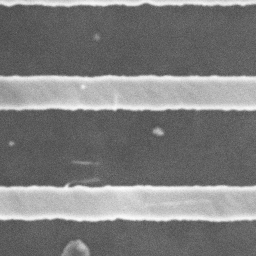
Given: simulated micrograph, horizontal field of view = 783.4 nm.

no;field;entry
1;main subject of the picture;lines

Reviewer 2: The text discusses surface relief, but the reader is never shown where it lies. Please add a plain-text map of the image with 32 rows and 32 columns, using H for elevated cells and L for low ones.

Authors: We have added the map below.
HHHHHHHHHHHHHHHHHHLHHHHHHHHHHHHH
LLLLLLLLLLLLLLLLLLLLLLLLLLLLLLLL
LLLLLLLLLLLLLLLLLLLLLLLLLLLLLLLL
LLLLLLLLLLLLLLLLLLLLLLLLLLLLLLLL
LLLLLLLLLLLLLLLLLLLLLLLLLLLLLLLL
LLLLLLLLLLLLLLLLLLLLLLLLLLLLLLLL
LLLLLLLLLLLLLLLLLLLLLLLLLLLLLLLL
LLLLLLLLLLLLLLLLLLLLLLLLLLLLLLLL
LLLLLLLLLLLLLLLLLLLLLLLLLLLLLLLL
LLLLLLLLLLLLLHLLLLLLLLLLLLLLLLLL
HHHHHHHHHHHHHHHHHHHHHHHHHHHHHHHH
HHHHHHHHHHHHHHHHHHHHHHHHHHHHHHHH
HHHHHHHHHHHHHHHHHHHHHHHHHHHHHHHH
HHHHHHLHHHHHHHHHHHHHHHHHHHHHHHHH
LLLLLLLLLLLLLLLLLLLLLLLLLLLLLLLL
LLLLLLLLLLLLLLLLLLLLLLLLLLLLLLLL
LLLLLLLLLLLLLLLLLLLLLLLLLLLLLLLL
LLLLLLLLLLLLLLLLLLLLLLLLLLLLLLLL
LLLLLLLLLLLLLLLLLLLLLLLLLLLLLLLL
LLLLLLLLLLLLLLLLLLLLLLLLLLLLLLLL
LLLLLLLLLLLLLLLLLLLLLLLLLLLLLLLL
LLLLLLLLLLLLLLLLLLLLLLLLLLLLLLLL
LLLLLLLLLLLLLLLLLLLLLLLLLLLLLLLL
HHHHHHHLHHHLHHHHHHHHHHHHHHHHHHHH
HHHHHHHHHHHHHHHHHHHHHHHHHHHHHHHH
HHHHHHHHHHHHHHHHHHHHHHHHHHHHHHHH
HHHHHHHHHHHHHHHHHHHHHHHHHHHHHHHH
LLLLLLLLLHHHHLLLLLLHHLLLLLHHHLLL
LLLLLLLLLLLLLLLLLLLLLLLLLLLLLLLL
LLLLLLLLLLLLLLLLLLLLLLLLLLLLLLLL
LLLLLLLLLLLLLLLLLLLLLLLLLLLLLLLL
LLLLLLLLLLLLLLLLLLLLLLLLLLLLLLLL